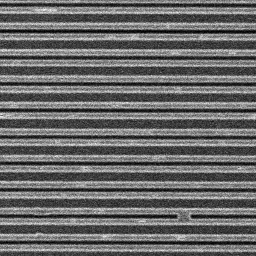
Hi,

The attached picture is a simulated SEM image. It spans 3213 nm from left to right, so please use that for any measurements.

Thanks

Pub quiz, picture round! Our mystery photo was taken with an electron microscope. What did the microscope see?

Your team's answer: parallel lines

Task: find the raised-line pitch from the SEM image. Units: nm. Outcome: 166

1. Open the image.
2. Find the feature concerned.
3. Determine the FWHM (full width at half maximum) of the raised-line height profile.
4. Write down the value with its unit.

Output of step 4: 6 px